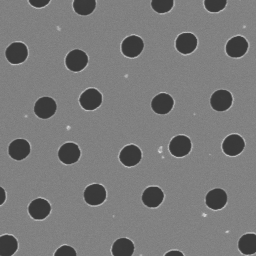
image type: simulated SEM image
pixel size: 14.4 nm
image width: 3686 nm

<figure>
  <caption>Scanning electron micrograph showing a regular array of holes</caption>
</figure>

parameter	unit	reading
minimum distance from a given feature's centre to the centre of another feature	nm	688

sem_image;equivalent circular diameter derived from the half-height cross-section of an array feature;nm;318